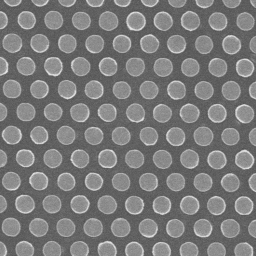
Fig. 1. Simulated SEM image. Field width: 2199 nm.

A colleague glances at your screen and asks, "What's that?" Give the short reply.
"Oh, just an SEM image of a regular array of raised bodies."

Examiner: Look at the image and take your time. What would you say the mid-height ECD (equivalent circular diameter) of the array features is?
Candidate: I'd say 157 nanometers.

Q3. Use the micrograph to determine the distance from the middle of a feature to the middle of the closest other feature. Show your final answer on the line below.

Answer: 0.228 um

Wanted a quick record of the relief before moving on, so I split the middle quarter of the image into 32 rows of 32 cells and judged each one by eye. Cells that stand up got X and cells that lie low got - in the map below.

--XXXX---XXXX---XXXX---XXXX--XXX
--XXXX---XXXX---XXXX---XXXX--XXX
---XXX----XX-----XX----XXX----XX
--------------------------------
XX----XXX-----------XX-----XX---
XXX---XXX----XXX---XXXX---XXXX--
XXX--XXXXX--XXXX---XXXX---XXXX--
XXX---XXXX---XXX---XXXX---XXXX--
XX-----XX-----X------X-----XX---
--------------------------------
---XX----XXX----XXX----XX-----XX
--XXXX---XXXX---XXXX---XXXX--XXX
--XXXX---XXXX---XXXX---XXXX--XXX
--XXXX---XXXX---XXXX---XXX----XX
------------------X------------X
--------------------------------
XX----XXX----XXX----XXX----XX---
XXX--XXXXX--XXXX---XXXX---XXXX--
XXX--XXXXX--XXXX---XXXX---XXXX--
XX----XXX----XXX----XXX---XXXX--
--------------------------------
---X----------------------------
--XXXX---X-XX---XXX----XXX----XX
--XXXX---XXXX---XXXX--XXXXX--XXX
--XXXX---XXXX---XXXX---XXXX--XXX
---XX----XXX----XXX----XXX----XX
--------------------------------
X-----XX-----XX-------------X---
XX---XXXX---XXXX---XXXX---XXXX--
XXX--XXXXX--XXXX---XXXX---XXXX--
XXX---XXX---XXXX---XXXX---XXXX--
X-------------X-----XX-----XX---